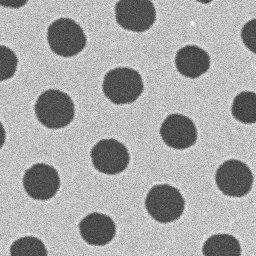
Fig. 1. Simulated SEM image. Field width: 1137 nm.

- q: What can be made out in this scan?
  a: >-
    a regular array of holes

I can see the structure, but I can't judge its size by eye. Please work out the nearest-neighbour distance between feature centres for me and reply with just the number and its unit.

320 nanometres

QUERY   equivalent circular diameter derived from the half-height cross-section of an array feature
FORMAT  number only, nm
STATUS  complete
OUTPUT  170